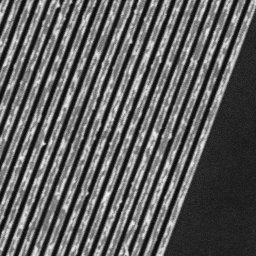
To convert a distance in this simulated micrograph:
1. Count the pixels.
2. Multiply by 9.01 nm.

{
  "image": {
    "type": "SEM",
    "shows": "parallel lines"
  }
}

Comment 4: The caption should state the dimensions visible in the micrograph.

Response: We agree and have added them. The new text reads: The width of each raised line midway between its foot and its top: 60.1 nm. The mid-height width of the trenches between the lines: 0.0432 microns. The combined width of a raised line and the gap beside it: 105 nm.